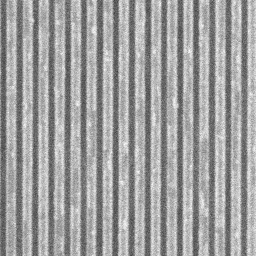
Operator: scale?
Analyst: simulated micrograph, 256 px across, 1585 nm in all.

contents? parallel lines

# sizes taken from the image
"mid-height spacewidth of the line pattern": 42.6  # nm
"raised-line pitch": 99.5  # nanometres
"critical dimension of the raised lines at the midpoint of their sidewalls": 54.2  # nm